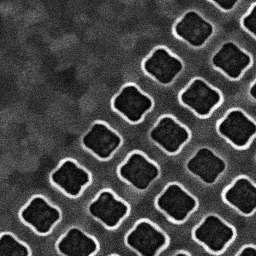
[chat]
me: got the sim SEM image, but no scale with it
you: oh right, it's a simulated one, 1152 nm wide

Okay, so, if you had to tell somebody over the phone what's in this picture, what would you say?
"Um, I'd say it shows a regular array of holes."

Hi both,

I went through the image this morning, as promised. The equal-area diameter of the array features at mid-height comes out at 146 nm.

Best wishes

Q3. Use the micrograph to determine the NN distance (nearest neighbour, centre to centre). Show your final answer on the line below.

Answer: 0.217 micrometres